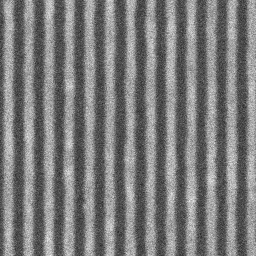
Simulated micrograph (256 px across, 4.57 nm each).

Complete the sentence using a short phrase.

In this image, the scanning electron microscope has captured parallel lines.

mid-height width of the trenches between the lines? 11.8 px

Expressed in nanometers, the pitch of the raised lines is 92.6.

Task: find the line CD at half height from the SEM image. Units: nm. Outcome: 38.2